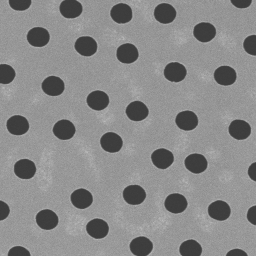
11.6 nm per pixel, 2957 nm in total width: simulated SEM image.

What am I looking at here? a regular array of holes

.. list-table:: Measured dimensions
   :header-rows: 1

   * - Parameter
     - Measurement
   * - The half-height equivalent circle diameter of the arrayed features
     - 249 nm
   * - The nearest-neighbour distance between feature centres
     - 490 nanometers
